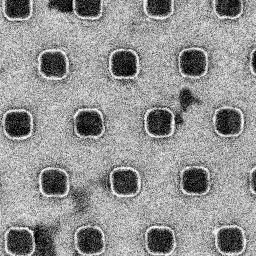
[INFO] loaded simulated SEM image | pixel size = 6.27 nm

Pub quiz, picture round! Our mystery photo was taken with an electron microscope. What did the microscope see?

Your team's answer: a regular array of raised bodies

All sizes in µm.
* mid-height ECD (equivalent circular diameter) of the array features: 0.189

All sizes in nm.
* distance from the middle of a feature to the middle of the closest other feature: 428